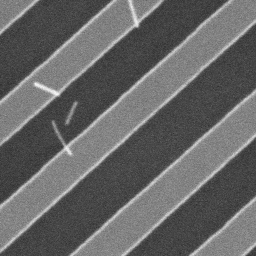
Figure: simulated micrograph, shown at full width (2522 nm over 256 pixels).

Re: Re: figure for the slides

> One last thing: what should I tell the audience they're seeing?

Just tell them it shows lines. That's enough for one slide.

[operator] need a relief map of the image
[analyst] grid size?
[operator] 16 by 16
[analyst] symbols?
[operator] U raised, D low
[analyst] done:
UUDDDDDUUUDDDDUU
UDDDDUUUUDDDDUUU
DDDDUUUDDDDDUUUD
DDDUUUDDDDUUUUDD
DDUUUDDDDUUUUDDD
DUUUDDDDUUUDDDDD
UUUDDDDUUUDDDDDU
UUDDDDUUUDDDDDUU
UDDDDUUUDDDDDUUU
DDDDUUUDDDDDUUUD
DDDUUUDDDDUUUUDD
DDUUUDDDDUUUUDDD
UUUUDDDDUUUUDDDD
UUUDDDDUUUDDDDDU
UDDDDDUUUDDDDDUU
DDDDDUUUDDDDUUUU